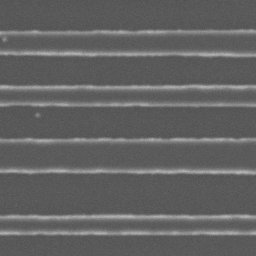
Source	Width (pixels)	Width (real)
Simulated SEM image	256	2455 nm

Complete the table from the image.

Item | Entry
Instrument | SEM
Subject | lines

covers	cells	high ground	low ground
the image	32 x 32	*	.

................................
................................
................................
................................
********************************
********************************
********************************
................................
................................
................................
................................
********************************
********************************
................................
................................
................................
................................
.........*..**.....*.***.****.**
********************************
********************************
********************************
.....................*....*..***
................................
................................
................................
................................
................................
********************************
********************************
................................
................................
................................